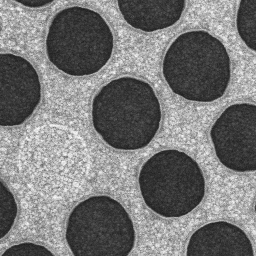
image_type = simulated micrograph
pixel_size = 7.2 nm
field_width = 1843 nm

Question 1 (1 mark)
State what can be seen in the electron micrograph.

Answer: holes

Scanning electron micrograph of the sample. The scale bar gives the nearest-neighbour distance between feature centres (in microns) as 0.605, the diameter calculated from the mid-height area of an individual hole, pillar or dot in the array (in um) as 0.498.